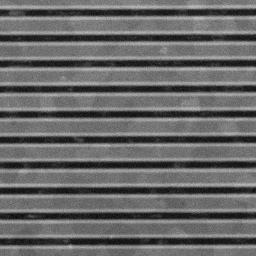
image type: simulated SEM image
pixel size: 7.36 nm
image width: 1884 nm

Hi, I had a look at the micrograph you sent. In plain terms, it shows parallel lines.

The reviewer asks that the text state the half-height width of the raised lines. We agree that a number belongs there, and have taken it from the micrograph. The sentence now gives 0.112 µm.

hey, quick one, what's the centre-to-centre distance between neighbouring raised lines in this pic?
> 187 nm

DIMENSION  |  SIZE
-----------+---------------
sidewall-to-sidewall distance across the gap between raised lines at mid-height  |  70.9 nanometres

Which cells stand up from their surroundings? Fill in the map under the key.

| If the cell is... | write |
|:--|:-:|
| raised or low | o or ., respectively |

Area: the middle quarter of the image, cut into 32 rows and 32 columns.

................................
oooooooooooooooooooooooooooooooo
oooooooooooooooooooooooooooooooo
oooooooooooooooooooooooooooooooo
oooooooooooooooooooooooooooooooo
................................
................................
................................
oooooooooooooooooooooooooooooooo
oooooooooooooooooooooooooooooooo
oooooooooooooooooooooooooooooooo
................................
................................
................................
oooooooooooooooooooooooooooooooo
oooooooooooooooooooooooooooooooo
oooooooooooooooooooooooooooooooo
...ooooo.oooo..........oo..o....
................................
................................
oooooooooooooooooooooooooooooooo
oooooooooooooooooooooooooooooooo
oooooooooooooooooooooooooooooooo
oooooooooooooooooooooooooooooooo
................................
................................
................................
oooooooooooooooooooooooooooooooo
oooooooooooooooooooooooooooooooo
oooooooooooooooooooooooooooooooo
................................
................................